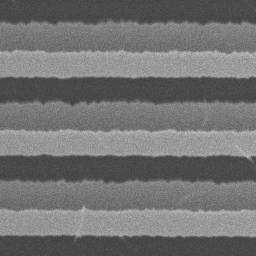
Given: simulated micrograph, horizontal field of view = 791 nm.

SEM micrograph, lines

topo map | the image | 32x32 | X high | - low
--------------------------------
--------------------------------
--------------------------------
XXXXXXXXXXXXXXXXXXXXXXXXXXXXXXXX
XXXXXXXXXXXXXXXXXXXXXXXXXXXXXXXX
XXXXXXXXXXXXXXXXXXXXXXXXXXXXXXXX
XXXXXXXXXXXXXXXXXXXXXXXXXXXXXXXX
XXXXXXXXXXXXXXXXXXXXXXXXXXXXXXXX
XXXXXXXXXXXXXXXXXXXXXXXXXXXXXXXX
XXXXXXXXXXXXXXXXXXXXXXXXXXXXXXXX
--------------------------------
--------------------------------
--------------------------------
XXXXXXXXXXXXXXXXXXXXXXXXXXXXXXXX
XXXXXXXXXXXXXXXXXXXXXXXXXXXXXXXX
XXXXXXXXXXXXXXXXXXXXXXXXXXXXXXXX
XXXXXXXXXXXXXXXXXXXXXXXXXXXXXXXX
XXXXXXXXXXXXXXXXXXXXXXXXXXXXXXXX
XXXXXXXXXXXXXXXXXXXXXXXXXXXXXXXX
-------------------X--X-XX----XX
--------------------------------
--------------------------------
--------------------------------
XXXXXXXXXXXXXXXXXXXXXXXXXXXXXXXX
XXXXXXXXXXXXXXXXXXXXXXXXXXXXXXXX
XXXXXXXXXXXXXXXXXXXXXXXXXXXXXXXX
XXXXXXXXXXXXXXXXXXXXXXXXXXXXXXXX
XXXXXXXXXXXXXXXXXXXXXXXXXXXXXXXX
XXXXXXXXXXXXXXXXXXXXXXXXXXXXXXXX
-----X---X--XX-XX--XXXXXXXXXXXXX
--------------------------------
--------------------------------